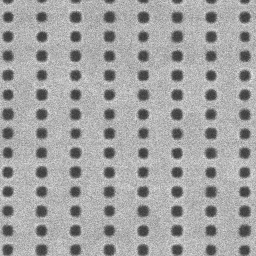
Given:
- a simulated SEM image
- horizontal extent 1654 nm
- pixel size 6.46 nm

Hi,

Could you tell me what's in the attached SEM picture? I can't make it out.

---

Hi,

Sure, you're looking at a regular array of holes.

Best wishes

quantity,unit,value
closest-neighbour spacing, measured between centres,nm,124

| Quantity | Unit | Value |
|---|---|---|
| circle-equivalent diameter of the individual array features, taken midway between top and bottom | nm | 79.6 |